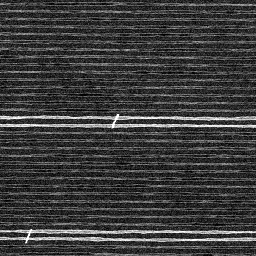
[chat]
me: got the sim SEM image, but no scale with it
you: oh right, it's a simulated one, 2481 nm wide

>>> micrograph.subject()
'parallel lines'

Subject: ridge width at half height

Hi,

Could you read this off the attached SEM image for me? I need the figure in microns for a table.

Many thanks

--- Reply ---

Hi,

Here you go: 0.0182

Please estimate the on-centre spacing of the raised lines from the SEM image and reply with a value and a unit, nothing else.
73.5 nanometers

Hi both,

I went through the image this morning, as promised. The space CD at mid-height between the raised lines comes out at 0.0545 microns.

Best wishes